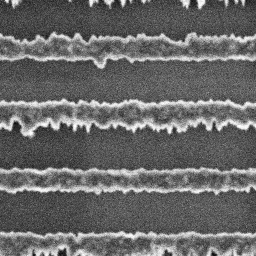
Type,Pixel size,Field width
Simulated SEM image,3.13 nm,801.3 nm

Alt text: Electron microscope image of one or a few lines or trenches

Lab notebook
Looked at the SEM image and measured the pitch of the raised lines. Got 0.206 um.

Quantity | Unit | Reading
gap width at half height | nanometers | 134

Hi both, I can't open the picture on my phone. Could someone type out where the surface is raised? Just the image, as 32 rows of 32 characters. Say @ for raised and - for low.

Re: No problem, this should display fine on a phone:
--------------------------------
--------------------------------
--------------------------------
--------------------------------
@-----@@-@-------@--@--@@-------
@@@@@@@@@@@@@@@@@@@@@@@@@@@@@@@@
@@@@@@@@@@@@@@@@@@@@@@@@@@@@@@@@
-@---@---@-@@---@@-----@@-@----@
--------------------------------
--------------------------------
--------------------------------
--------------------------------
--------------------------------
@@@@@@@@@@@@@@@@@@@@@@@@@@@@@@@@
@@@@@@@@@@@@@@@@@@@@@@@@@@@@@@@@
@@-@@@@@-@@@@@@@@@@@@@@@@--@-@@@
---@----------------------------
--------------------------------
--------------------------------
--------------------------------
--------------------------------
@@@@@@@@@@@@@@@@@@@@@@@@@@@@@@@@
@@@@@@@@@@@@@@@@@@@@@@@@@@@@@@@@
@@@@@@@@@@@@@@@@@@@@@@@@@@@@@@@@
--------------------------------
--------------------------------
--------------------------------
--------------------------------
--------------------------------
@@@@@@@@@@@@@@@@@@@@@@@@@@@@@@@@
@@@@@@@@@@@@@@@@@@@@@@@@@@@@@@@@
@@@@@@@-@@@@@@@@@@@@-@@@@@@@@@@@